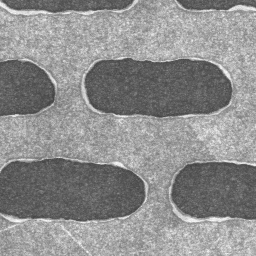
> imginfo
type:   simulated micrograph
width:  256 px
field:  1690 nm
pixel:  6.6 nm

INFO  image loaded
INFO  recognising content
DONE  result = holes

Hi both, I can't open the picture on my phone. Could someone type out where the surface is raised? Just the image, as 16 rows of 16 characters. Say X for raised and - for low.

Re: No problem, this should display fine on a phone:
--------XXXX----
XXXXXXXXXXXXXXXX
XXXXXXXXXXXXXXXX
XXXXXXXXXXXXXXXX
---XX---------XX
---XX---------XX
---XXX--------XX
XXXXXXXXXXXXXXXX
XXXXXXXXXXXXXXXX
XXXXXXXXXXXXXXXX
--------XXX-----
---------XX-----
---------XX-----
--------XXX-----
XXXXXXXXXXXXXXXX
XXXXXXXXXXXXXXXX